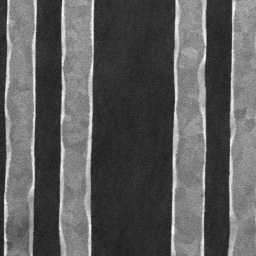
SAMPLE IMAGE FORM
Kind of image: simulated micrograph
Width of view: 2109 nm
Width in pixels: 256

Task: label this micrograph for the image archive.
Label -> wiring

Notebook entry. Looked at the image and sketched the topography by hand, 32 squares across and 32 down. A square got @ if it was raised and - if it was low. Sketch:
-@@@----@@@@----------@@@@---@@@
-@@@----@@@-----------@@@@---@@@
-@@@----@@@-----------@@@----@@@
-@@@----@@@-----------@@@@---@@@
-@@@----@@@@----------@@@@---@@@
-@@@----@@@@----------@@@@---@@@
-@@@----@@@@----------@@@@---@@@
-@@@----@@@@----------@@@@---@@@
-@@@----@@@-----------@@@----@@@
-@@@----@@@-----------@@@----@@@
-@@@----@@@-----------@@@----@@@
-@@@----@@@-----------@@@----@@@
-@@@----@@@-----------@@@----@@@
-@@@----@@@-----------@@@----@@@
-@@@----@@@-----------@@@----@@@
-@@@----@@@-----------@@@----@@@
-@@@----@@@-----------@@@@---@@@
-@@@----@@@-----------@@@@---@@@
-@@@----@@@-----------@@@@---@@@
-@@@----@@@-----------@@@@---@@@
-@@@----@@@-----------@@@@---@@@
-@@@----@@@-----------@@@@---@@@
-@@@----@@@-----------@@@----@@@
-@@@----@@@-----------@@@@---@@@
-@@@----@@@-----------@@@@---@@@
-@@@----@@@-----------@@@----@@@
-@@@----@@@-----------@@@----@@@
-@@@----@@@-----------@@@----@@@
-@@@----@@@-----------@@@----@@@
-@@@----@@@-----------@@@----@@@
-@@@----@@@-----------@@@----@@@
-@@@----@@@-----------@@@----@@@